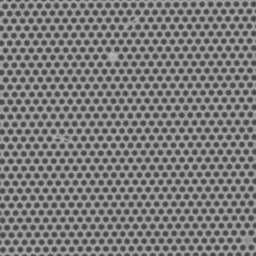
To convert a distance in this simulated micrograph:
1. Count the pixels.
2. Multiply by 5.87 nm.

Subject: a regular array of holes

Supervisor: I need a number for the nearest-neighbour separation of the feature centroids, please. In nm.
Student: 47.7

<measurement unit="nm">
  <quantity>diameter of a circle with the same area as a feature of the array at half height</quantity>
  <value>33.8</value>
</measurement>